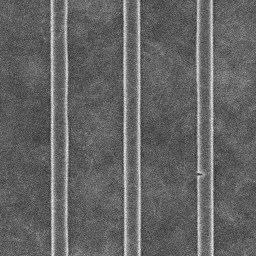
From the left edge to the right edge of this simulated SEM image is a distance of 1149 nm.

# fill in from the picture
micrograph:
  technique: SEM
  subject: one or a few lines or trenches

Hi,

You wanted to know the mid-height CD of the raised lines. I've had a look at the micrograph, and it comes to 0.0673 µm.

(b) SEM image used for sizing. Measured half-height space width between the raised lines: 259 nanometers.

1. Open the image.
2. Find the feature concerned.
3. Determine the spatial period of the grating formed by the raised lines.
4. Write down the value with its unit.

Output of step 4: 327 nm